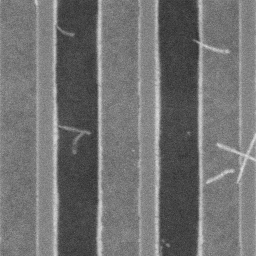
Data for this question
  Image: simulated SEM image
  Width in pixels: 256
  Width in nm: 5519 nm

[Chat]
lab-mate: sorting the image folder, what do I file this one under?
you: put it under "lines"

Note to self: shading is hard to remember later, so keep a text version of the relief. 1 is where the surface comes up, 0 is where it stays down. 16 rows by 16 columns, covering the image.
1110001111000111
1110001111000111
1110001111000111
1110001111000111
1110001111000111
1110001111000111
1110001111000111
1110001111000111
1110001111000111
1110001111000111
1110001111000111
1110001111000111
1110001111000111
1110001111000111
1110001111000111
1110001111000111